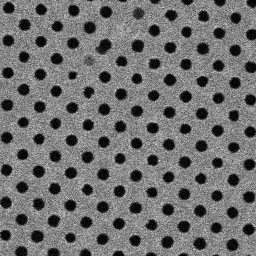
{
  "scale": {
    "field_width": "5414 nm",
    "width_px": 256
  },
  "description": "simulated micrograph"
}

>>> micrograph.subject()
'a regular array of holes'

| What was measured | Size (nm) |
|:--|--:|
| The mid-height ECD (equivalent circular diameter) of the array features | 253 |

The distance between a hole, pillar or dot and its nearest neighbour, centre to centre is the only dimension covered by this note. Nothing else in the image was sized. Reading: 476 nm